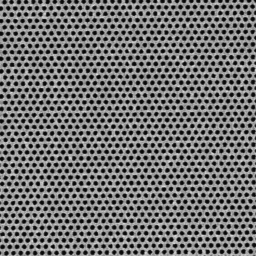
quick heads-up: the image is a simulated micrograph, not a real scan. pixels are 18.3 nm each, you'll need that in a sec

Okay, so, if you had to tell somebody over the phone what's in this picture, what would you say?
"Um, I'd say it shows a regular array of holes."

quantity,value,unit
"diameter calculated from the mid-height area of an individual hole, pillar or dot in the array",92.3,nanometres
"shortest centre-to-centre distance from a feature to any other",0.124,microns